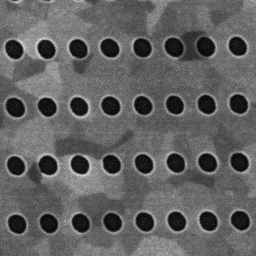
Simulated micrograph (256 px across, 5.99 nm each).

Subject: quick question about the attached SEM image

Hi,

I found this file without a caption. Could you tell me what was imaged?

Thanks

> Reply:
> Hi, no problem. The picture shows a regular array of holes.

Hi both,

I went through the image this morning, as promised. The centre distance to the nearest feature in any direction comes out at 31.8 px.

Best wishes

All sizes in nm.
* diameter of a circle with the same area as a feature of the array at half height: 119